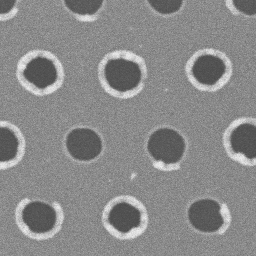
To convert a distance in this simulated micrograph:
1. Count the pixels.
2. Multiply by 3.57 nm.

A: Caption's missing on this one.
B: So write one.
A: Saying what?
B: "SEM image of a regular array of holes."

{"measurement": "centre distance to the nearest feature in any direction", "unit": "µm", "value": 0.288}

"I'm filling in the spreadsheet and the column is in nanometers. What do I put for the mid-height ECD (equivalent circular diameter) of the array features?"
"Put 122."